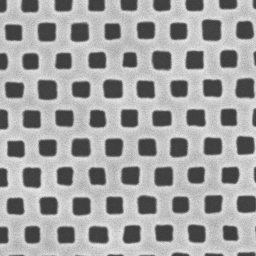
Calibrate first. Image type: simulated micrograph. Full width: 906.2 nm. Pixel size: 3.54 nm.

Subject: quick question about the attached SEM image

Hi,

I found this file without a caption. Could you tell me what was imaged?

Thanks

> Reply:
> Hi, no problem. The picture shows a regular array of holes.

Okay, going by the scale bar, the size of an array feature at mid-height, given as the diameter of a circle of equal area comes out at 0.0688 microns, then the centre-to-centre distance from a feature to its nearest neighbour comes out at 115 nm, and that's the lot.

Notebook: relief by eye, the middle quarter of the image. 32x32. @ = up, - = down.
--@@@@-----@@@@---@@@@-----@@@--
@@@@@@@@@@@@@@@@@@@@@@@@@@@@@@@@
@@@@@@@@@@@@@@@@@@@@@@@@@@@@@@@@
@@@@@@@@@@@@@@@@@@@@@@@@@@@@@@@@
@@@---@@@@-----@@@----@@@@@----@
@@-----@@@-----@@@-----@@@@----@
@@-----@@@-----@@@-----@@@@----@
@@-----@@@-----@@@-----@@@@----@
@@@@@@@@@@@---@@@@@---@@@@@@@@@@
@@@@@@@@@@@@@@@@@@@@@@@@@@@@@@@@
@@@@@@@@@@@@@@@@@@@@@@@@@@@@@@@@
--@@@@@--@@@@@@---@@@@@--@@@@@@-
---@@@----@@@@-----@@@-----@@@--
---@@@-----@@@-----@@@-----@@@@-
---@@@-----@@@-----@@@-----@@@@-
--@@@@----@@@@@---@@@@----@@@@@-
@@@@@@@@@@@@@@@@@@@@@@@@@@@@@@@@
@@@@@@@@@@@@@@@@@@@@@@@@@@@@@@@@
@@@-@@@@@@@@@-@@@@@@@@@@@@@---@@
@@----@@@@-----@@@-----@@@-----@
@@-----@@@-----@@@-----@@@-----@
@@-----@@@-----@@@-----@@@-----@
@@-----@@@----@@@@@----@@@-----@
@@@@@@@@@@@@@@@@@@@@@@@@@@@@-@@@
@@@@@@@@@@@@@@@@@@@@@@@@@@@@@@@@
@@@@@@@@@@@@@@@@@@@@@@@@@@@@@@@@
--@@@@----@@@@@----@@@@----@@@@-
--@@@@----@@@@-----@@@-----@@@@-
--@@@@----@@@@-----@@@-----@@@@-
--@@@@@----@@@-----@@@@----@@@@-
@@@@@@@@@@@@@@@@@@@@@@@@---@@@@@
@@@@@@@@@@@@@@@@@@@@@@@@@@@@@@@@